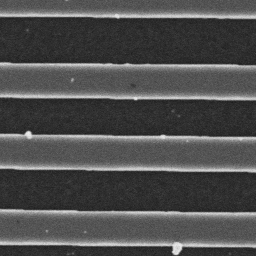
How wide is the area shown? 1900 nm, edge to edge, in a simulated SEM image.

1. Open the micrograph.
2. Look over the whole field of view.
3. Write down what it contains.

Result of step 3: lines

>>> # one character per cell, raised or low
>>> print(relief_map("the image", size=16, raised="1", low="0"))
1111111111111111
0000000000000000
0000000000000000
0000000000000000
1111111111111111
1111111111111111
0000000000000000
0000000000000000
1111110000100000
1111111111111111
1111111111111111
0000000000000000
0000000000000000
1111111111111111
1111111111111111
0000000000010000